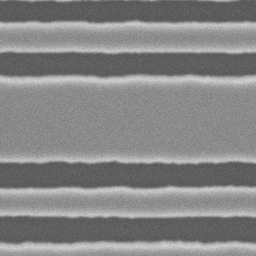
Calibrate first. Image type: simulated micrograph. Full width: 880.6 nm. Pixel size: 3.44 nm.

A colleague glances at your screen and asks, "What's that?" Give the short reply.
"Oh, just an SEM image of lines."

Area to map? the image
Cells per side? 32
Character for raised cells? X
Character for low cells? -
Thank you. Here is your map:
--------------------------------
--------------------------------
--------------------------------
XXXXXXXXXXXXXXXXXXXXXXXXXXXXXXXX
XXXXXXXXXXXXXXXXXXXXXXXXXXXXXXXX
XXXXXXXXXXXXXXXXXXXXXXXXXXXXXXXX
-------------XX-X-------X---XXX-
--------------------------------
--------------------------------
--------------------------------
XXXXXXXXXXXXXXXXXXXXXXXXXXXXXXXX
XXXXXXXXXXXXXXXXXXXXXXXXXXXXXXXX
XXXXXXXXXXXXXXXXXXXXXXXXXXXXXXXX
XXXXXXXXXXXXXXXXXXXXXXXXXXXXXXXX
XXXXXXXXXXXXXXXXXXXXXXXXXXXXXXXX
XXXXXXXXXXXXXXXXXXXXXXXXXXXXXXXX
XXXXXXXXXXXXXXXXXXXXXXXXXXXXXXXX
XXXXXXXXXXXXXXXXXXXXXXXXXXXXXXXX
XXXXXXXXXXXXXXXXXXXXXXXXXXXXXXXX
XXXXXXXXXXXXXXXXXXXXXXXXXXXXXXXX
--------------------------------
--------------------------------
--------------------------------
-------XXX--XXXX----XXXX-XXXXXXX
XXXXXXXXXXXXXXXXXXXXXXXXXXXXXXXX
XXXXXXXXXXXXXXXXXXXXXXXXXXXXXXXX
XXXXXXXXXXXXXXXXXXXXXXXXXXXXXXXX
--------------------------------
--------------------------------
--------------------------------
---X------XXXXXXXXXXXXXXX-XXXXX-
XXXXXXXXXXXXXXXXXXXXXXXXXXXXXXXX